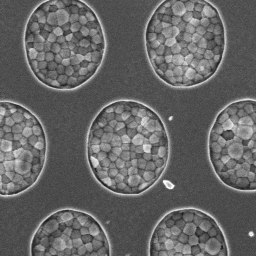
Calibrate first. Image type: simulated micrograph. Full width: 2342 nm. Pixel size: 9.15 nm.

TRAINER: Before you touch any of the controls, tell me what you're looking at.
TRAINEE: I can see holes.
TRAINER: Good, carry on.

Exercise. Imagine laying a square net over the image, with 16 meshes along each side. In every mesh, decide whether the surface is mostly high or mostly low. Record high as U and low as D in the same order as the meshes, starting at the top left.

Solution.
UUDDDDUUUUDDDUUU
UUDDDDUUUDDDDDUU
UUDDDDUUUDDDDDUU
UUDDDDUUUDDDDDUU
UUDDDDUUUUDDDUUU
UUUDDUUUUUUUUUUU
DUUUUUUDDUUUUUUD
DDUUUUDDDDUUUDDD
DDDUUUDDDDUUUDDD
DDDUUDDDDDDUUDDD
DDDUUUDDDDUUUDDD
DDUUUUDDDDUUUUDD
UUUUUUUUUUUUUUUU
UUUDDDUUUUDDDUUU
UUDDDDUUUUDDDDUU
UUDDDDDUUDDDDDUU